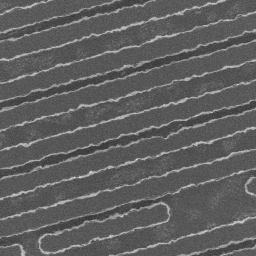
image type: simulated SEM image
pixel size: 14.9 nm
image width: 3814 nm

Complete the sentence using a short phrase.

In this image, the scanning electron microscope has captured parallel lines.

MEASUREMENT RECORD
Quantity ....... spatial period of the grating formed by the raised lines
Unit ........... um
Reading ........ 0.49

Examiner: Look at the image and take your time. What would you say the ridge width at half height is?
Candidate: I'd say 284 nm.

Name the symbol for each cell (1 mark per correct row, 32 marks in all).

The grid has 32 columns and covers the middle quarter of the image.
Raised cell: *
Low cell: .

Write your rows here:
*******************.....********
**************.......***********
**********.......***************
*****..........*****************
**........*****************.....
......*******************.......
...*******************..........
*****************...............
**************.................*
**********...................***
****....................********
***.................************
................****************
.............*******************
..........*****************.....
.......*****************........
...*****************.........***
******************.........*****
**************.......****.******
**********........**************
******..........****************
***.......*******************...
.......******************.......
...******************...........
******************..............
**************..................
**********...................***
******...................*******
***..................***********
...................*************
...............****************.
............*****************...